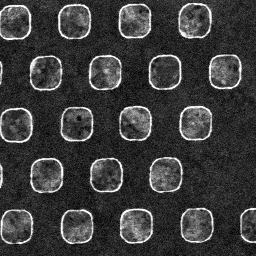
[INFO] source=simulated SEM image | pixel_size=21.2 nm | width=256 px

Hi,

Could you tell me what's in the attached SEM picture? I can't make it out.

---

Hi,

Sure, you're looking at a regular array of raised bodies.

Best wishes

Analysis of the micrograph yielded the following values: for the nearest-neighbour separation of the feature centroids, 1.25 micrometres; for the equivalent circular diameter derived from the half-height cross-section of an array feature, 0.726 µm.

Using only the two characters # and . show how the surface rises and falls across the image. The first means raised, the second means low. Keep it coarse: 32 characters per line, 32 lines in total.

........................#.......
####....###....####....###......
####...####....####...####......
####....###....####...####......
###.....###.....##.....###......
................................
................................
....###.....###....###.....###..
....####...####....####...####..
....####...####....####...####..
....###....####....###.....###..
................................
................................
................##.....###......
####....####...####....###......
####....####...####....###......
####....###....####....###......
.##......#......................
................................
................................
....####....###....####.........
....####...####....####.........
....####...####....####.........
....###.....###....###..........
................................
................................
.##.....###.....##.....###.....#
####....####...####....####...##
####....####...####....####...##
####....###....####....###....##
................................
................................